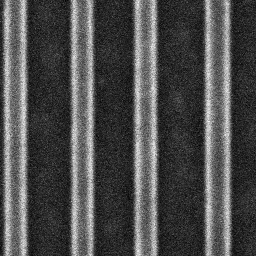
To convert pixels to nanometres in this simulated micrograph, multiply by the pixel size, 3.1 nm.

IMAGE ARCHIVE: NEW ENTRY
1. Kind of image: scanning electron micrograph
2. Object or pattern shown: one or a few lines or trenches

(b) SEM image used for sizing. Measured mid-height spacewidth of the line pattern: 157 nanometers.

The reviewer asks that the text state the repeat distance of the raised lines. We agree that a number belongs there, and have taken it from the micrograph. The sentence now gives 209 nm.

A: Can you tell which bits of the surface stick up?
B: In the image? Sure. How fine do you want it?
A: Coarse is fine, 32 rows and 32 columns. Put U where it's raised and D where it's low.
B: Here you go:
DUUDDDDDDUUDDDDDDUUDDDDDDDUUDDDD
DUUDDDDDDUUDDDDDDUUDDDDDDDUUDDDD
DUUDDDDDDUUDDDDDDUUDDDDDDDUUDDDD
DUUDDDDDDUUDDDDDDUUDDDDDDDUUDDDD
DUUDDDDDDUUDDDDDDUUDDDDDDDUUDDDD
DUUDDDDDDUUDDDDDDUUDDDDDDDUUDDDD
DUUDDDDDDUUDDDDDDUUDDDDDDDUUDDDD
DUUDDDDDDUUDDDDDDUUDDDDDDDUUDDDD
DUUDDDDDDUUDDDDDDUUDDDDDDDUUDDDD
DUUDDDDDDUUDDDDDDUUDDDDDDDUUDDDD
DUUDDDDDDUUDDDDDDUUDDDDDDDUUDDDD
DUUDDDDDDUUDDDDDDUUDDDDDDDUUDDDD
DUUDDDDDDUUDDDDDDUUDDDDDDDUUDDDD
DUUDDDDDDUUDDDDDDUUDDDDDDDUUDDDD
DUUDDDDDDUUDDDDDDUUDDDDDDDUUDDDD
DUUDDDDDDUUDDDDDDUUDDDDDDDUUDDDD
DUUDDDDDDUUDDDDDDUUDDDDDDDUUDDDD
DUUDDDDDDUUDDDDDDUUDDDDDDDUUDDDD
DUUDDDDDDUUDDDDDDUUDDDDDDDUUDDDD
DUUDDDDDDUUDDDDDDUUDDDDDDDUUDDDD
DUUDDDDDDUUDDDDDDUUDDDDDDDUUDDDD
DUUDDDDDDUUDDDDDDUUDDDDDDDUUDDDD
DUUDDDDDDUUDDDDDDUUDDDDDDDUUDDDD
DUUDDDDDDUUDDDDDDUUDDDDDDDUUDDDD
DUUDDDDDDUUDDDDDDUUDDDDDDDUUDDDD
DUUDDDDDDUUDDDDDDUUDDDDDDDUUDDDD
DUUDDDDDDUUDDDDDDUUDDDDDDDUUDDDD
DUUDDDDDDUUDDDDDDUUDDDDDDDUUDDDD
DUUDDDDDDUUDDDDDDUUDDDDDDDUUUDDD
DUUDDDDDDUUDDDDDDUUDDDDDDDUUUDDD
DUUDDDDDDUUDDDDDDUUDDDDDDDUUUDDD
DUUDDDDDDUUDDDDDDUUDDDDDDDUUDDDD